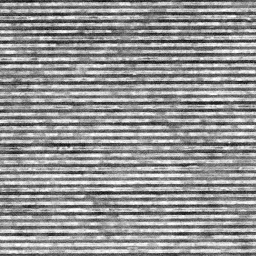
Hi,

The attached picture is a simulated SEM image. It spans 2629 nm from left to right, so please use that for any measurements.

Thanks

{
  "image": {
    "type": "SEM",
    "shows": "parallel lines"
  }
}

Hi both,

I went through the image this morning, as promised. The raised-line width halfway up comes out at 2.75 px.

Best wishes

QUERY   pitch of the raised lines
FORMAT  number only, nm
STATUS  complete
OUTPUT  70.7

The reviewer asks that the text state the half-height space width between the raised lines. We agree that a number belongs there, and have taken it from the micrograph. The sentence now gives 44.9 nanometers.